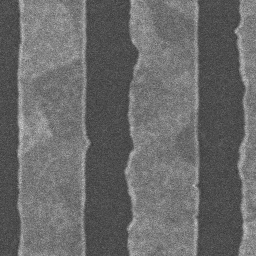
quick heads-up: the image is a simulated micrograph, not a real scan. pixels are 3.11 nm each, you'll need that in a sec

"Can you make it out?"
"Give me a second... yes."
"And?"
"one or a few lines or trenches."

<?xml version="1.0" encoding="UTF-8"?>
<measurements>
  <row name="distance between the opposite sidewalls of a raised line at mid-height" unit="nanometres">200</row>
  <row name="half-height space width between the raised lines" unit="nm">145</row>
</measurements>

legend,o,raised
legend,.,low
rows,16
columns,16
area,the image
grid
.oooo...oooo...o
.oooo...oooo...o
.oooo...oooo...o
.oooo....ooo...o
.oooo...oooo...o
.oooo...oooo...o
.oooo...oooo...o
.oooo...oooo...o
.oooo...oooo...o
.oooo...oooo...o
.oooo...oooo...o
.oooo...oooo...o
.oooo...oooo...o
.oooo...oooo...o
.oooo...oooo...o
.oooo...oooo...o